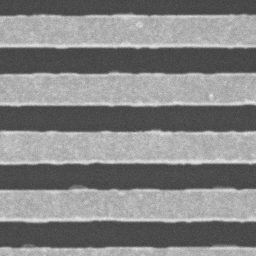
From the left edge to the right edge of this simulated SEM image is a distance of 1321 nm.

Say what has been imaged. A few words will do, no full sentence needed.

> lines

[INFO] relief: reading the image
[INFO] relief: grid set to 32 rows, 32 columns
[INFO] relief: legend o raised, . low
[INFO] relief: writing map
................................
................................
oooooooooooooooooooooooooooooooo
oooooooooooooooooooooooooooooooo
oooooooooooooooooooooooooooooooo
oooooooooooooooooooooooooooooooo
................................
................................
................................
oooooooooooooooooooooooooooooooo
oooooooooooooooooooooooooooooooo
oooooooooooooooooooooooooooooooo
oooooooooooooooooooooooooooooooo
................................
................................
................................
oooooooo....oo....oooo...oo.oo.o
oooooooooooooooooooooooooooooooo
oooooooooooooooooooooooooooooooo
oooooooooooooooooooooooooooooooo
................................
................................
................................
................................
oooooooooooooooooooooooooooooooo
oooooooooooooooooooooooooooooooo
oooooooooooooooooooooooooooooooo
oooooooo.ooo...oooooooooo...oooo
................................
................................
................................
oooooooooooooooooooooooooooooooo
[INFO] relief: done